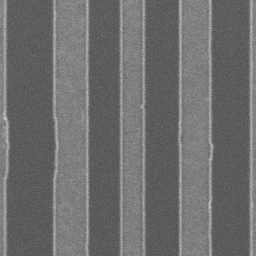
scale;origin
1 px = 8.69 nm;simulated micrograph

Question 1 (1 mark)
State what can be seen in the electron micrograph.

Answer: one or a few lines or trenches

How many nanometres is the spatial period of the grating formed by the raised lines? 581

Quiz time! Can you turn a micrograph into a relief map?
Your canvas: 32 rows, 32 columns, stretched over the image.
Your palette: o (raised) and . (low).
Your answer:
.oooooo....oooo...oooo....ooooo.
.oooooo....oooo...oooo....ooooo.
.oooooo....oooo...oooo....ooooo.
.oooooo....oooo...oooo....ooooo.
.oooooo....oooo...oooo....ooooo.
.oooooo....oooo...oooo....ooooo.
.oooooo....oooo...oooo....ooooo.
.oooooo....oooo...oooo....ooooo.
.oooooo....oooo...oooo....ooooo.
.oooooo....oooo...oooo....ooooo.
.oooooo....oooo...oooo....ooooo.
.oooooo....oooo...oooo....ooooo.
.oooooo....oooo...oooo....ooooo.
.oooooo....oooo...oooo....ooooo.
ooooooo....oooo...oooo....ooooo.
.oooooo....oooo...oooo....ooooo.
.oooooo....oooo...oooo....ooooo.
.oooooo....oooo...oooo....ooooo.
.oooooo....oooo...oooo....ooooo.
.oooooo....oooo...oooo....ooooo.
.oooooo....oooo...oooo....ooooo.
.oooooo....oooo...oooo....ooooo.
.oooooo....oooo...oooo....ooooo.
.oooooo....oooo...ooooo...ooooo.
.oooooo....oooo...ooooo...ooooo.
.oooooo....oooo...ooooo...oooooo
.oooooo....oooo...ooooo...ooooo.
.oooooo....oooo...ooooo...ooooo.
.oooooo....oooo...ooooo...ooooo.
.oooooo....oooo...ooooo...ooooo.
.oooooo....oooo...ooooo...ooooo.
.oooooo....oooo...ooooo...ooooo.